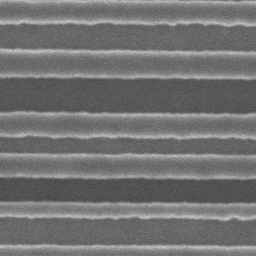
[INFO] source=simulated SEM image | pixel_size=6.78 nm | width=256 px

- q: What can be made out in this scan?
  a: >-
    lines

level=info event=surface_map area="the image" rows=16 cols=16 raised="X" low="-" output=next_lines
XXXXXXXXXXXXXXXX
XXXXXXXXXXXXXXXX
XXXXXXXXXXXXXXXX
XXXXXXXXXXXXXXXX
XXXXXXXXXXXXXXXX
----------------
----------------
XXXXXXXXXXXXXXXX
XXXXXXXXXXXXXXXX
XXXXXXXXXXXXXXXX
XXXXXXXXXXXXXXXX
----------------
----------------
XXXXXXXXXXXXXXXX
XXXXXXXXXXXXXXXX
XXXXXXXXXXXXXXXX